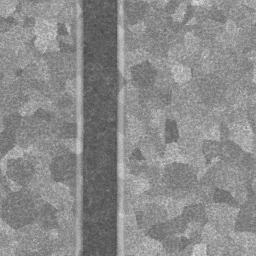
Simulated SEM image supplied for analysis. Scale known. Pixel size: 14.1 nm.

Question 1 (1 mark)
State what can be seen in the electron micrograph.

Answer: one or a few lines or trenches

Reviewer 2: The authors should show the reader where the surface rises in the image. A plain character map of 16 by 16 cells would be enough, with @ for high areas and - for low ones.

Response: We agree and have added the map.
@@@@@---@@@@@@@@
@@@@@---@@@@@@@@
@@@@@---@@@@@@@@
@@@@@---@@@@@@@@
@@@@@---@@@@@@@@
@@@@@---@@@@@@@@
@@@@@---@@@@@@@@
@@@@@---@@@@@@@@
@@@@@---@@@@@@@@
@@@@@---@@@@@@@@
@@@@@---@@@@@@@@
@@@@@---@@@@@@@@
@@@@@---@@@@@@@@
@@@@@---@@@@@@@@
@@@@@---@@@@@@@@
@@@@@---@@@@@@@@